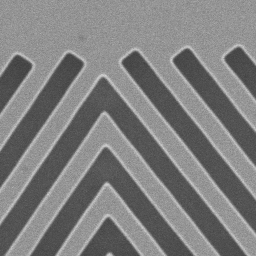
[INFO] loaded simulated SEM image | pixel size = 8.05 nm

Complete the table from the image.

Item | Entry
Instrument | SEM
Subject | groups of lines, slits or small figures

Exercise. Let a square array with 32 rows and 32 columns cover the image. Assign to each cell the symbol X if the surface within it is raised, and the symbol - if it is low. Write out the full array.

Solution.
XXXXXXXXXXXXXXXXXXXXXXXXXXXXXXXX
XXXXXXXXXXXXXXXXXXXXXXXXXXXXXXXX
XXXXXXXXXXXXXXXXXXXXXXXXXXXXXXXX
XXXXXXXXXXXXXXXXXXXXXXXXXXXXXXXX
XXXXXXXXXXXXXXXXXXXXXXXXXXXXXXXX
XXXXXXXXXXXXXXXXXXXXXXXXXXXXXXXX
XXXXXXXXXXXXXXXXXXXXXXX-XXXXX--X
X--XXXXX--XXXXX---XXXX---XXX---X
X---XXX---XXXXXX---XXX----XXX---
---XXX----XXXXXX----XXX---XXXX--
---XXX---XXX--XXX---XXXX---XXX--
--XXX---XXX----XXX---XXXX---XXX-
-XXX----XXX----XXXX---XXX----XXX
-XXX---XXX------XXX----XXX----XX
XXX---XXX----X---XXX----XXX---XX
XX----XXX---XX----XXX----XXX---X
XX---XXX---XXXX----XXX---XXXX---
X---XXX---XXXXXX---XXXX---XXX---
---XXXX---XXX-XXX---XXX----XXX--
---XXX---XXX--XXXX---XXX----XXX-
--XXX---XXXX---XXX----XXX---XXXX
-XXXX---XXX-----XXX----XXX---XXX
-XXX---XXX-------XXX---XXXX---XX
XXX---XXX----X----XXX---XXX----X
XXX---XXX---XXX---XXXX---XXX----
XX---XXX---XXXXX---XXX----XXX---
X---XXX----XXXXX----XXX----XXX--
----XXX---XXX-XXX----XXX---XXXX-
---XXX---XXX---XXX----XXX---XXX-
--XXX----XXX----XXX---XXX----XXX
--XXX---XXX-----XXXX---XXX----XX
-XXX---XXX-------XXX----XXX---XX